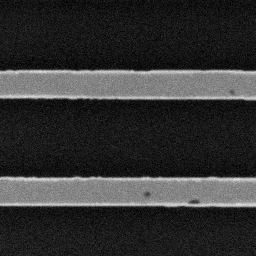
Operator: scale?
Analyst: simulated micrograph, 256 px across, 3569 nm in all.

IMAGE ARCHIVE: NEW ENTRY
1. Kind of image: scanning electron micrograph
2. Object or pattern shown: lines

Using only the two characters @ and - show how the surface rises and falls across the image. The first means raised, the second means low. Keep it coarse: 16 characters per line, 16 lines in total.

----------------
----------------
----------------
----------------
@@@@@@@@@@@@@@@@
@@@@@@@@@@@@@@@@
----------------
----------------
----------------
----------------
----------------
@@@@@@@@@@@@@@@@
@@@@@@@@@@@@@@@@
----------------
----------------
----------------